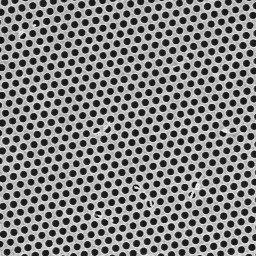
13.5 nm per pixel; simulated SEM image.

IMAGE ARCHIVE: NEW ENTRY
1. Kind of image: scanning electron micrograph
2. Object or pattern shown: a regular array of holes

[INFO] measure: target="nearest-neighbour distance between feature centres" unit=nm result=139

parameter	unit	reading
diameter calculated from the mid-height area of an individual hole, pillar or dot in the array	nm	97.3